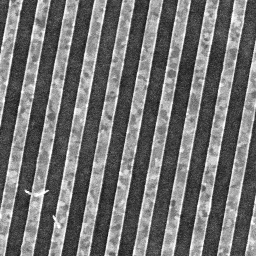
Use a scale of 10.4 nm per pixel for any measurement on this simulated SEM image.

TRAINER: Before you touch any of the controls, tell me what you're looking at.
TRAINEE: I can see parallel lines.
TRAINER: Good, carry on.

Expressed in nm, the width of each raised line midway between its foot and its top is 120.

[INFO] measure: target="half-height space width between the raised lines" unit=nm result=170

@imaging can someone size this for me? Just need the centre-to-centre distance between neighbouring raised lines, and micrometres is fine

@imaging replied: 0.286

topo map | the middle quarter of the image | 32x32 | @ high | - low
@----@@@----@@@----@@@----@@@---
-----@@-----@@@----@@-----@@----
----@@@-----@@----@@@----@@@----
----@@@----@@@----@@@----@@@----
----@@@----@@@----@@@----@@@----
----@@@----@@@----@@@----@@@----
----@@@----@@@----@@@----@@@----
----@@-----@@----@@@-----@@-----
---@@@----@@@----@@@----@@@----@
---@@@----@@@----@@@----@@@----@
---@@@----@@@----@@@----@@@----@
---@@@----@@@----@@@----@@@----@
---@@-----@@@----@@-----@@-----@
--@@@-----@@----@@@----@@@-----@
--@@@----@@@----@@@----@@@----@@
--@@@----@@@----@@@----@@@----@@
--@@@----@@@----@@@----@@@----@@
--@@@----@@@----@@-----@@@----@@
--@@-----@@----@@@-----@@-----@@
-@@@----@@@----@@@----@@@----@@@
-@@@----@@@----@@@----@@@----@@@
-@@@----@@@----@@@----@@@----@@@
-@@@----@@@----@@@----@@@----@@@
-@@-----@@@----@@-----@@-----@@@
@@@-----@@----@@@----@@@-----@@-
@@@----@@@----@@@----@@@----@@@-
@@@----@@@----@@@----@@@----@@@-
@@@----@@@----@@@----@@@----@@@-
@@@----@@@----@@@----@@@----@@@-
@@-----@@-----@@-----@@-----@@--
@@----@@@----@@@----@@@-----@@--
@@----@@@----@@@----@@@----@@@--